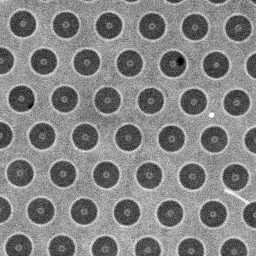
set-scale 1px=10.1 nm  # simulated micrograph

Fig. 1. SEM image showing an array of small figures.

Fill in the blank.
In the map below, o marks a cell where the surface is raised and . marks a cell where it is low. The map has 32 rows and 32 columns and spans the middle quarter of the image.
oo.......oooo.......oooo.......o
ooo......oooo.......oooo......oo
oooo....oooooo.....oooooo.....oo
oooooooooooooooooooooooooooooooo
oooooooooooooooooooooooooooooooo
.ooooooooooooooooooooooooooooooo
...oooooo....ooooooo....ooooooo.
...ooooo......ooooo......ooooo..
....ooo.......oooo.......oooo...
....ooo.......oooo...o...oooo...
...ooooo......ooooo......oooo...
..oooooo.....oooooo.....oooooo..
oooooooooo..ooooooooo..oooooooo.
oooooooooooooooooooooooooooooooo
oooooooooooooooooooooooooooooooo
ooo....ooooooo....oooooooo..oooo
oo......ooooo......ooooo......oo
oo.......oooo......ooooo......oo
oo...o...oooo...o...ooo...o...oo
oo.......oooo......ooooo......oo
ooo.....ooooo......ooooo......oo
oooo...ooooooo....ooooooo....ooo
oooooooooooooooooooooooooooooooo
oooooooooooooooooooooooooooooooo
..ooooooo...ooooooooo.oooooooooo
...ooooo.....oooooo.....oooooo..
...oooo.......oooo......ooooo...
...oooo...o...oooo...o...oooo...
...oooo.......oooo.......oooo...
...ooooo......oooo......ooooo...
..ooooooo....oooooo.....oooooo..
ooooooooooooooooooooooooooooooo.